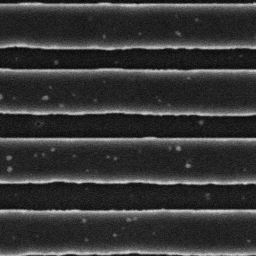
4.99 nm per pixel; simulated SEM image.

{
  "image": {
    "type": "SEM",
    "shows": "lines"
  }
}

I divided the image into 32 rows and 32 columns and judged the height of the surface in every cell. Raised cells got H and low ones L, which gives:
LLLHHLLLLLLLHHLLLLLLLLLLLLLLLLLL
HHHHHHHHHHHHHHHHHHHHHHHHHHHHHHHH
HHHHHHHHHHHHHHHHHHHHHHHHHHHHHHHH
HHHHHHHHHHHHHHHHHHHHHHHHHHHHHHHH
HHHHHHHHHHHHHHHHHHHHHHHHHHHHHHHH
HHHHHHHHHHHHHHHHHHHHHHHHHHHHHHHH
LLLLLLLLLLLLLLLLLLLLLLLLLLLLLLLL
LLLLLLLLLLLLLLLLLLLLLLLLLLLLLLLL
LLLLLLLLLLLLLLLLLLLLLLLLLLLLLLLL
HHHHHHHHHHHHHHHHHHHHHHHHHHHHHHHH
HHHHHHHHHHHHHHHHHHHHHHHHHHHHHHHH
HHHHHHHHHHHHHHHHHHHHHHHHHHHHHHHH
HHHHHHHHHHHHHHHHHHHHHHHHHHHHHHHH
HHHHHHHHHHHHHHHHHHHHHHHHHHHHHHHH
LLLLLLLLLLLLLLLLLLLLLLLLLLLLLLLL
LLLLLLLLLLLLLLLLLLLLLLLLLLLLLLLL
LLLLLLLLLLLLLLLLLLLLLLLLLLLLLLLL
HHHHHHHHHHHHHHHHHHHHHHHHHHHHHHHH
HHHHHHHHHHHHHHHHHHHHHHHHHHHHHHHH
HHHHHHHHHHHHHHHHHHHHHHHHHHHHHHHH
HHHHHHHHHHHHHHHHHHHHHHHHHHHHHHHH
HHHHHHHHHHHHHHHHHHHHHHHHHHHHHHHH
HHHHHHHHHHHHHHHHHHHHHHHHHHHHHHHH
LLLLLLLLLLLLLLLLLLLLLLLLLLLLLLLL
LLLLLLLLLLLLLLLLLLLLLLLLLLLLLLLL
LLLLLLLLLLLLLLLLLLLLLLLLLLLLLLLL
HHHHHHHHHHHHHHHHHHHHHHHHHHHHHHHH
HHHHHHHHHHHHHHHHHHHHHHHHHHHHHHHH
HHHHHHHHHHHHHHHHHHHHHHHHHHHHHHHH
HHHHHHHHHHHHHHHHHHHHHHHHHHHHHHHH
HHHHHHHHHHHHHHHHHHHHHHHHHHHHHHHH
HHHHHHHHHHHHHHHHHHHHHHHHHHHHHHHH